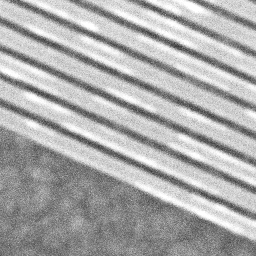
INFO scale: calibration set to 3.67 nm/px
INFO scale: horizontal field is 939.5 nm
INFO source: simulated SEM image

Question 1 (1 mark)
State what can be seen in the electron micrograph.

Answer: parallel lines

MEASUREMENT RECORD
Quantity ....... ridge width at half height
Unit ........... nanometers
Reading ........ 54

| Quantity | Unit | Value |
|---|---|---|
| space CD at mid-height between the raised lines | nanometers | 35.1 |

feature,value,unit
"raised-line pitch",91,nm